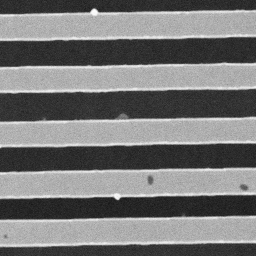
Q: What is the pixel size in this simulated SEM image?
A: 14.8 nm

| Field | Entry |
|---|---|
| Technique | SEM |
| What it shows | lines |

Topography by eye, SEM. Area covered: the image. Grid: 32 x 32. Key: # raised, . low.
................................
...........#............########
################################
################################
################################
................................
................................
................................
################################
################################
################################
#############...................
................................
................................
................................
################################
################################
################################
................................
................................
................................
......##########################
################################
################################
####################............
................................
................................
.........#######################
################################
################################
################.##.............
................................